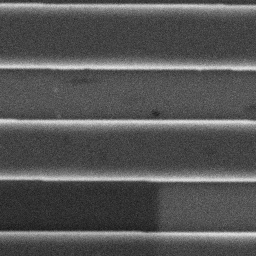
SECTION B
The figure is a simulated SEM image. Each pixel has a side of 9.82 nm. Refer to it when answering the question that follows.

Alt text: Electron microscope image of lines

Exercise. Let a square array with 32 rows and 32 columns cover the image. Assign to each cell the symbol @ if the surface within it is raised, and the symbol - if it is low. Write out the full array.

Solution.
--------------------------------
@@@@@@@@@@@@@@@@@@@@@@@@@@@@@@@@
@@@@@@@@@@@@@@@@@@@@@@@@@@@@@@@@
@@@@@@@@@@@@@@@@@@@@@@@@@@@@@@@@
@@@@@@@@@@@@@@@@@@@@@@@@@@@@@@@@
@@@@@@@@@@@@@@@@@@@@@@@@@@@@@@@@
@@@@@@@@@@@@@@@@@@@@@@@@@@@@@@@@
@@@@@@@@@@@@@@@@@@@@@@@@@@@@@@@@
-----------------@@@@@@@@@@@@@@@
--------------------------------
--------------------------------
--------------------------------
--------------------------------
--------------------------------
--------------------------------
@@@@@@@@@@@@@@@@@@@@@@@@@@@@@@@@
@@@@@@@@@@@@@@@@@@@@@@@@@@@@@@@@
@@@@@@@@@@@@@@@@@@@@@@@@@@@@@@@@
@@@@@@@@@@@@@@@@@@@@@@@@@@@@@@@@
@@@@@@@@@@@@@@@@@@@@@@@@@@@@@@@@
@@@@@@@@@@@@@@@@@@@@@@@@@@@@@@@@
@@@@@@@@@@@@@@@@@@@@@@@@@@@@@@@@
------------------------@@@@@@@@
--------------------------------
--------------------------------
--------------------------------
--------------------------------
--------------------------------
--------------------------------
@@@@@@@@@@@@@@@@@@@@@@@@@@@@@@@@
@@@@@@@@@@@@@@@@@@@@@@@@@@@@@@@@
@@@@@@@@@@@@@@@@@@@@@@@@@@@@@@@@